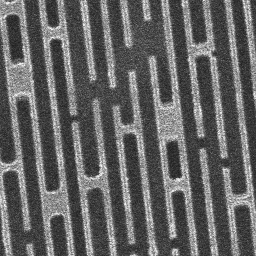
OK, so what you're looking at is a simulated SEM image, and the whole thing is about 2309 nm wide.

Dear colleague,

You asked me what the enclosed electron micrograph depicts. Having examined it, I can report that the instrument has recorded parallel lines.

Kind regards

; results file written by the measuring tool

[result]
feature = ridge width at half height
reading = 77.3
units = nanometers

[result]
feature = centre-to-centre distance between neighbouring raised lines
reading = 184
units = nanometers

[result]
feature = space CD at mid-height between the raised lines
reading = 110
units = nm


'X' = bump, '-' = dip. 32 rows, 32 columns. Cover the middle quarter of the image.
XX----XX---XX--------XX---XX---X
XX----XX---XX--------XX---XX---X
XX----XX---XX---XX---XX---XX---X
XX----XX---XX---XX----XX---X----
-X---------XX---XX----XX---X----
-X---------XX---XX----XX---XX---
-XX-------------XX----XX---XX---
-XX--------------XX---XX---XX---
-XX--------------XX---XX---XX---
-XX----XX--------XX---XX---XX---
-XX----XX---X----XX---XXXXXXX---
-XX----XX---XX---XX---XXXXXXX---
-XX----XX---XX---XX----XXXXXX---
-------XX---XX---XX----XXXXXXX--
--X-----X---XXX--XX----XXXXXXX--
--XX----XX---XXXXXXX---XXXXXXX--
--XX----XX---XXXXXXX---XXXXXXX--
--XX----XX---XXX-XXX---XXXXXXX--
--XX----XX---XX---XX---XXXXXXX--
--XX----XX---XX---XX---XXXXXXX--
--XX----XX---XX---XX----XX--XX--
--XX----XX---XX---XX----XX---X--
--XX-----X---XX---XX----XX---XX-
---XX----X---XX---XX----XX---XX-
---XX----XX---XX---XX---XX---XX-
---XX----XX---XX---XX---XX---XX-
---XX----XX---XX---XX---XX---XX-
---XX----XX---XX---XX---XX---XX-
X--XXXXXXXX---XX---XX----XX--XX-
X--XXXXXXXX---XX---XX----XXXXXX-
X--XXXXXXXX---XX---XX----XXXXXXX
X---XXX--XX---XX---XX----XXXXXXX